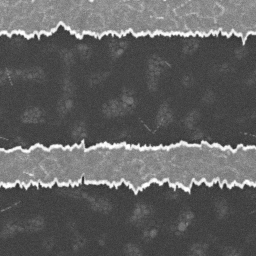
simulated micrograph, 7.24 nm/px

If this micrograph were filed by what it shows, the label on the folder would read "one or a few lines or trenches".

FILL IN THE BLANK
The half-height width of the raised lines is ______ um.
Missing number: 0.279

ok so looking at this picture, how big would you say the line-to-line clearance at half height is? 815 nanometres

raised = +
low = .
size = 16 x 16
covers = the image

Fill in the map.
++++++++++++++++
++++++++++++++++
................
................
................
................
................
................
................
++++++++++++++++
++++++++++++++++
+++++...+..+..++
................
................
................
................